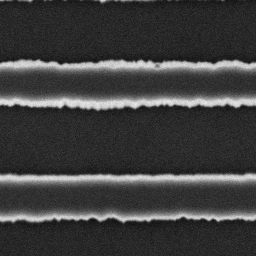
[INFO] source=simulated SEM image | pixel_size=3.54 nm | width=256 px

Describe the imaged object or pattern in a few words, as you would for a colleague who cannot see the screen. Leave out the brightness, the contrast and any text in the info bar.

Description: lines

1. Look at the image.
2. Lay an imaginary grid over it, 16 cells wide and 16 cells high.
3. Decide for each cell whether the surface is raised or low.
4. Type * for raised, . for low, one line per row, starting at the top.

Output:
................
................
................
................
****************
****************
..**.****.......
................
................
................
................
****************
****************
****************
................
................